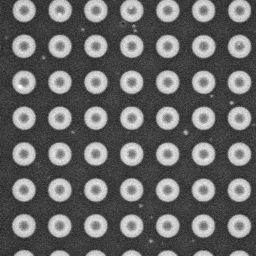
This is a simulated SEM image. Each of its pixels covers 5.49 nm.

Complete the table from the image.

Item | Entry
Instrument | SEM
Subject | an array of small figures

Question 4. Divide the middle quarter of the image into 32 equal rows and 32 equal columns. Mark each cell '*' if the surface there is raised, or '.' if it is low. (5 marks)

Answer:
................................
................................
*.....****.....****.....****....
**...******...******...******...
**...******...******...******...
**...******...******...******...
*.....****.....****.....****....
................................
................................
................................
................................
*.....****.....****.....****....
**...******...******...*****....
**...******...******...******...
**...******...******...******...
*.....****.....****.....****....
................................
................................
................................
................................
*.....****.....****.....****....
**...******...******...*****....
**...******...******...******...
**...******...******...******...
*.....****.....****.....****....
................................
................................
................................
................................
*.....****.....****.....****....
**...******...******...******...
**...******...******...******...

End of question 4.